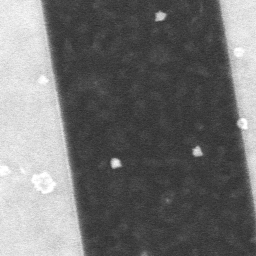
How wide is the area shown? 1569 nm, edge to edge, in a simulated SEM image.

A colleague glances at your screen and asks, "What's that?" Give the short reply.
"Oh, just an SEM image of one or a few lines or trenches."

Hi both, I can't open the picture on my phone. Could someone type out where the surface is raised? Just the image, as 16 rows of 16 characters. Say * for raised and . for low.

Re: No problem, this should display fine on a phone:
...***********..
...***********..
...***********..
...***********..
...************.
...************.
....***********.
....***********.
....***********.
....***********.
....************
....************
.....***********
.....***********
.....***********
.....***********